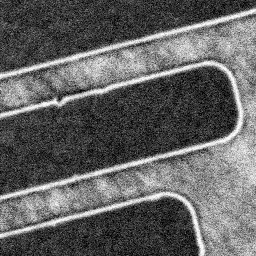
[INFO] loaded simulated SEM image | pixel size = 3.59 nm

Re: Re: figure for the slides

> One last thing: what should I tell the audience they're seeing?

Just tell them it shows one or a few lines or trenches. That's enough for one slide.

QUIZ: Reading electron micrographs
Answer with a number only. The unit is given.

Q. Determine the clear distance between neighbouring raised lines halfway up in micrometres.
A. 0.134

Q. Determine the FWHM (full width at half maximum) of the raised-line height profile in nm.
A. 286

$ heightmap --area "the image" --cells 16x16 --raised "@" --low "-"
@@@@@@@@@@@@@@@@
@@@@@@@@@@@@@---
@@@@@@@@@-------
@@@@@-----------
@----------@@@--
-------@@@@@@@@-
---@@@@@@@@@@@@-
@@@@@@@@@@@@@@@-
@@@@@@@@@@@@@@--
@@@@@@@@@@@-----
@@@@@@@---------
@@@-------------
---------@@-----
-----@@@@@@@----
-@@@@@@@@@@@----
@@@@@@@@@@@@@---